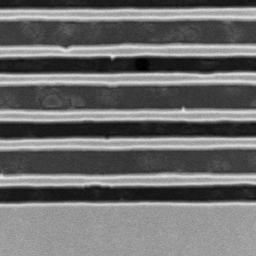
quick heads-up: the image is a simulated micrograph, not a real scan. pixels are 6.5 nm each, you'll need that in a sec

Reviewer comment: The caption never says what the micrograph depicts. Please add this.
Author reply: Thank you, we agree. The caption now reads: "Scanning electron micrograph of parallel lines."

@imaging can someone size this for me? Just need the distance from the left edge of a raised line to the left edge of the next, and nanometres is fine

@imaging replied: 217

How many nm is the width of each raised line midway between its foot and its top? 77.2